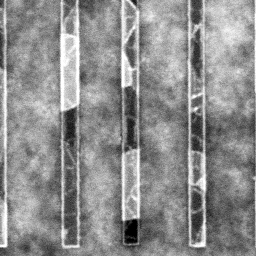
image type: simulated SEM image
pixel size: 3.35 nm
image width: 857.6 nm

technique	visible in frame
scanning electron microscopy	one or a few lines or trenches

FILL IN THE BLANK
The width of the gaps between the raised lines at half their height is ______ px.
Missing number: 50.8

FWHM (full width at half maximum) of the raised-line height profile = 15.4 px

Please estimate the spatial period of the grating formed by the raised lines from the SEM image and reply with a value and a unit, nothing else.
0.212 microns